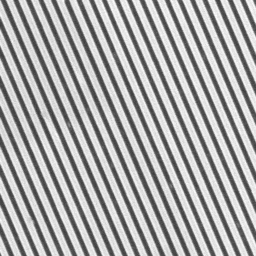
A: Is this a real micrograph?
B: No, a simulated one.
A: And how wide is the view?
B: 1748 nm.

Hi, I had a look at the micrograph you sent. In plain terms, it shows parallel lines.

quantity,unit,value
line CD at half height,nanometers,42.4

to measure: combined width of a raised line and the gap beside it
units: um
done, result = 0.0792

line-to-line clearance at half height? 36.9 nm